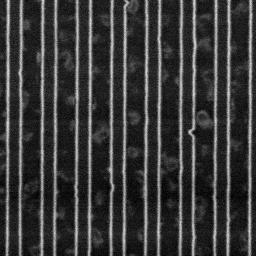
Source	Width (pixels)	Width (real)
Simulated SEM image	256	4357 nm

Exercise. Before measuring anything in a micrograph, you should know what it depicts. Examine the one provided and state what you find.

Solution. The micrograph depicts parallel lines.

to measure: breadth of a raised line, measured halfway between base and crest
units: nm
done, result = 230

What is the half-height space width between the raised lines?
360 nm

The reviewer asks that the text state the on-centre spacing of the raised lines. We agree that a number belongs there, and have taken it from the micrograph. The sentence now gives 590 nm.